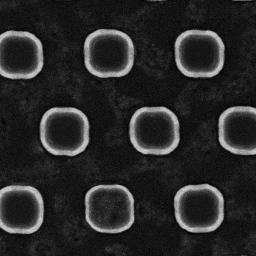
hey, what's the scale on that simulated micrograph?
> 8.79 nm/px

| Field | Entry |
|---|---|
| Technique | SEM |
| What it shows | raised bodies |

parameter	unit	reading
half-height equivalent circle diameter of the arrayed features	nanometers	412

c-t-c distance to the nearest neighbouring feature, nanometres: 787